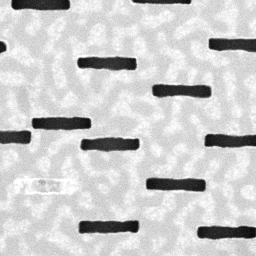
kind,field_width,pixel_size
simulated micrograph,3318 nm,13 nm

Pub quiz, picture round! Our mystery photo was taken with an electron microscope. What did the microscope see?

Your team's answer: holes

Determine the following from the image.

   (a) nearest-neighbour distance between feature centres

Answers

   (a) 77.1 pixels